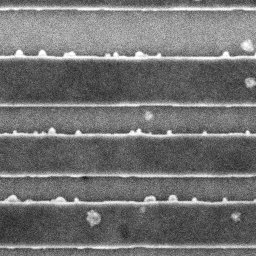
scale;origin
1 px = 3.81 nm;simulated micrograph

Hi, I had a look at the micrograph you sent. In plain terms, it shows lines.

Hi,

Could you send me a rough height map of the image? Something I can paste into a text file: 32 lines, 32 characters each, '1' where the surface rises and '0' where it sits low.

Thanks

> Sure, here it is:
11111111111111111111111111111111
00000000000000000000000000000000
00000000000000000000000000000000
00000000000000000000000000000000
00000000000000000000000000000000
00000000000000000000000000000000
00000000000000000000000000000000
11111111111111111111111111111111
11111111111111111111111111111111
11111111111111111111111111111111
11111111111111111111111111111111
11111111111111111111111111111111
11111111111111111111111111111111
00000000000000000000000000000000
00000000000000000000000000000000
00000000000000000000000000000000
00000000000000000000000000000000
11111111111111111111111111111111
11111111111111111111111111111111
11111111111111111111111111111111
11111111111111111111111111111111
11111111111111111111111111111111
00000000000000000000000000000000
00000000000000000000000000000000
00000000000000000000000000000000
11111111111111111111111111111111
11111111111111111111111111111111
11111111111111111111111111111111
11111111111111111111111111111111
11111111111111111111111111111111
11111111111111111111111111111111
00000000000000000000000000000000